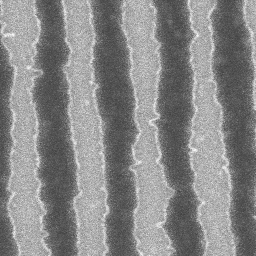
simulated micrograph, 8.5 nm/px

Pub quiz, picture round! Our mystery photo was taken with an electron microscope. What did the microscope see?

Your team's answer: one or a few lines or trenches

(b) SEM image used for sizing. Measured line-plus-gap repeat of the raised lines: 0.516 microns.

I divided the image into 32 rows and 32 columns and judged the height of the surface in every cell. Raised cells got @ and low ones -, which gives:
----@@@@---@@@@----@@@@@---@@@@-
----@@@@---@@@@----@@@@@--@@@@@-
-----@@@---@@@@----@@@@@--@@@@@-
-----@@@---@@@@----@@@@@--@@@@@-
@----@@@----@@@@---@@@@@@-@@@@@@
@---@@@@@---@@@@----@@@@---@@@@@
@---@@@@@--@@@@@----@@@@--@@@@@@
@---@@@@@--@@@@@----@@@@--@@@@@@
@@--@@@@---@@@@@@---@@@@--@@@@@@
@@---@@@----@@@@----@@@@--@@@@@@
@@--@@@@@---@@@@@---@@@@---@@@@@
@@--@@@@@---@@@@@---@@@@---@@@@@
@---@@@@@---@@@@@--@@@@@---@@@@@
@---@@@@@---@@@@@--@@@@@@---@@@@
@@--@@@@@---@@@@@--@@@@@----@@@@
@@---@@@@----@@@@--@@@@@----@@@@
@@---@@@@----@@@@@--@@@@----@@@@
@@--@@@@@----@@@@---@@@@----@@@@
@@--@@@@@----@@@@---@@@@----@@@@
@----@@@@@---@@@@---@@@@----@@@@
@----@@@@@---@@@@---@@@@----@@@@
@@--@@@@@@---@@@@---@@@@----@@@@
@----@@@@@---@@@@----@@@-----@@@
@----@@@@@---@@@@----@@@-----@@@
@@---@@@@@---@@@@----@@@@----@@@
@----@@@@----@@@@----@@@@----@@@
@----@@@@@---@@@@----@@@@---@@@@
@@---@@@@@---@@@@---@@@@@----@@@
@@---@@@@@---@@@@---@@@@@----@@@
@@----@@@@---@@@@----@@@@@---@@@
@@---@@@@@---@@@@----@@@@@---@@@
@@@---@@@@---@@@@----@@@@@---@@@